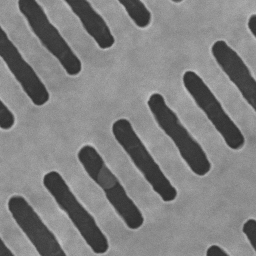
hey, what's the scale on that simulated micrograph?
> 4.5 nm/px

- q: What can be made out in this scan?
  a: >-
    holes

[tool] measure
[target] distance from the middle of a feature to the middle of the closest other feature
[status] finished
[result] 191 nm